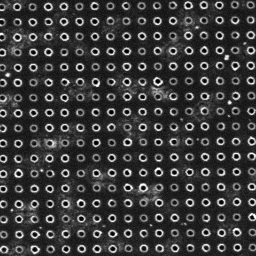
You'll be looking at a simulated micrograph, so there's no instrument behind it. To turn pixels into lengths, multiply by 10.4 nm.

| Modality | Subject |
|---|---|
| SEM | a regular array of holes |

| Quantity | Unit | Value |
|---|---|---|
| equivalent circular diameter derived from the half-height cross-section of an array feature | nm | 56.4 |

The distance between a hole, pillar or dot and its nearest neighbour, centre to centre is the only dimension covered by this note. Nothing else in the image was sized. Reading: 15 px